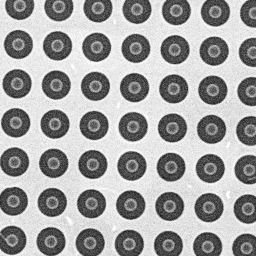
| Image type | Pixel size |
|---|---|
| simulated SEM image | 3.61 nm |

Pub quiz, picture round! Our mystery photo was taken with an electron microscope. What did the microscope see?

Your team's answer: an array of small figures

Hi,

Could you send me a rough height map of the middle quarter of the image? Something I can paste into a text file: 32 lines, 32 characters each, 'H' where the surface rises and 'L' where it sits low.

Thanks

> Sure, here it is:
HHHHHHHHHHHHHHHHHHHHHHHHHHHHHHHH
HHHHHHHHHHHHHHHHHHHHHHHHHHHHHHHH
LHHHHHLLLLHHHHHHLLLHHHHHHHHLHHHH
LHHHHLLLLLLHHHHLLLLLLHHHHLLLLLHH
LLHHLLLHHLLHHHLLLLLLLHHHLLLLLLLH
LLHHLLLHHLLLHHLLHHHLLHHHLLHHHLLH
LLHHLLLHHLLHHHLLHHHLLHHHLLHHHLLH
LHHHHLLLLLLHHHLLLLLLLHHHLLLHLLLH
HHHHHLLLLLHHHHHLLLLLHHHHLLLLLLHH
HHHHHHHHHHHHHHHHLLLHHHHHHHLLLHHH
HHHHHHHHHHHHHHHHHHHHHHHHHHHHHHHH
HHHHHHHHHHHHHHHHHHHHHHHHHHHHHHHH
HHHHHLLLLLHHHHHLLLLLHHHHHHLLHHHH
LHHHLLLLLLLHHHLLLLLLLHHHLLLLLLHH
LLHHLLHHHLLHHHLLLHLLLHHHLLLLLLLH
LHHHLLHHHLLHHLLLHHLLLHHLLLHHLLLH
LHHHLLLHLLLHHLLLHHLLLHHLLLHHLLLH
LHHHLLLLLLLHHHLLLLLLLHHHLLLLLLLH
HHHHHLLLLLHHHHLLLLLLHHHHLLLLLLHH
HHHHHHHHHHHHHHHHLLHHHHHHHHLLHHHH
HHHHHHHHHHHHHHHHHHHHHHHHHHHHHHHH
HHHHHHLLHHHHHHHHHHHHHHHHHHHHHHHH
HHHHHLLLLLHHHHLLLLLHHHHHHLLLLHHH
LHHHLLLLLLLHHHLLLLLLHHHHLLLLLLHH
LHHLLLHHLLLHHLLLHHLLLHHLLLHLLLHH
LHHLLLHHLLLHHLLLHHLLLHHLLHHHLLLH
LHHHLLLLLLLHHLLLHHLLLHHLLLHHLLHH
HHHHLLLLLLHHHHLLLLLLHHHLLLLLLLHH
HHHHHHLLLHHHHHHLLLLHHHHHLLLLLHHH
HHHHHHHHHHHHHHHHHHHHHHHHHHLHHHHH
HHHHHHHHHHHHHHHHHHHHHHHHHHHHHHHH
HHHHHHLLHHHHHHHHLHHHHHHHHHHHHHHH